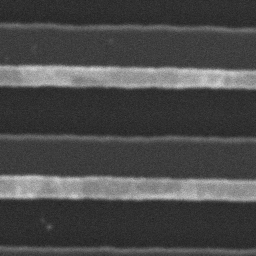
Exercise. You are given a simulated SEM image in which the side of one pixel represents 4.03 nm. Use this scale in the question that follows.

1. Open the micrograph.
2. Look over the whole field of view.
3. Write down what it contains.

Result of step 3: lines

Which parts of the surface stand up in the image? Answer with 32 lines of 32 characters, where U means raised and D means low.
DDDDDDDDDDDDDDDDDDDDDDDDDDDDDDDD
DDDDDDDDDDDDDDDDDDDDDDDDDDDDDDDD
DDDDDDDDDDDDDDDDDDDDDDDDDDDDDDDD
UUUUUUUUUUUUUUUUUUUUUUUUUUUDDDDD
UUUUUUUUUUUUUUUUUUUUUUUUUUUUUUUU
UUUUUUUUUUUUUUUUUUUUUUUUUUUUUUUU
UUUUUUUUUUUUUUUUUUUUUUUUUUUUUUUU
UUUUUUUUUUUUUUUUUUUUUUUUUUUUUUUU
UUUUUUUUUUUUUUUUUUUUUUUUUUUUUUUU
UUUUUUUUUUUUUUUUUUUUUUUUUUUUUUUU
UUUUUUUUUUUUUUUUUUUUUUUUUUUUUUUU
DDDDDDDDDDDDDDDDDDDDDDDDDDDDDDDD
DDDDDDDDDDDDDDDDDDDDDDDDDDDDDDDD
DDDDDDDDDDDDDDDDDDDDDDDDDDDDDDDD
DDDDDDDDDDDDDDDDDDDDDDDDDDDDDDDD
DDDDDDDDDDDDDDDDDDDDDDDDDDDDDDDD
DDDDDDDDDDDDDDDDDDDDDDDDDDDDDDDD
UUUUUUUUUUUUUUUUUUUUUUUUUUUUUUUU
UUUUUUUUUUUUUUUUUUUUUUUUUUUUUUUU
UUUUUUUUUUUUUUUUUUUUUUUUUUUUUUUU
UUUUUUUUUUUUUUUUUUUUUUUUUUUUUUUU
UUUUUUUUUUUUUUUUUUUUUUUUUUUUUUUU
UUUUUUUUUUUUUUUUUUUUUUUUUUUUUUUU
UUUUUUUUUUUUUUUUUUUUUUUUUUUUUUUU
UUUUUUUUUUUUUUUUUUUUUUUUUUUUUUUU
DDDDDDDDDDDDDDDDDDDDDDDDDDDDDDDD
DDDDDDDDDDDDDDDDDDDDDDDDDDDDDDDD
DDDDDDDDDDDDDDDDDDDDDDDDDDDDDDDD
DDDDDDDDDDDDDDDDDDDDDDDDDDDDDDDD
DDDDDDDDDDDDDDDDDDDDDDDDDDDDDDDD
DDDDDDDDDDDDDDDDDDDDDDDDDDDDDDDD
UUUUUUUUUUUUUUUUUUUUUUUUUUUUUUUU